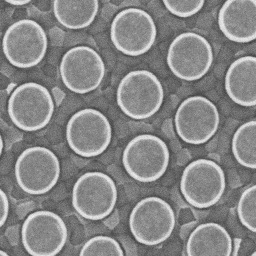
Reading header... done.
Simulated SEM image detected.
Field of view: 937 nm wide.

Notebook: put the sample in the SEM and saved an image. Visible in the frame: a regular array of raised bodies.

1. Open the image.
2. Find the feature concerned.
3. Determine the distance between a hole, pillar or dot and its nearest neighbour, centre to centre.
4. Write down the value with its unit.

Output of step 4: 228 nanometres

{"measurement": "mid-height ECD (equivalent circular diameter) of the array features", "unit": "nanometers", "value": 158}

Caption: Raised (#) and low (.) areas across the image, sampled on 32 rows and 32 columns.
.......#####.........####...####
.......#####...###....##....####
.......####...#####.........####
.####.........#####.........####
.#####........#####....##....###
.#####........#####...####......
.####....###....##...#####......
.####...#####........#####....##
........#####........#####...###
........#####...###...###...####
........####...#####........####
..####.........#####.........###
.#####.........#####....##...###
.#####.........#####...####.....
.#####...####...##....#####.....
..###....####.........#####....#
.........#####........#####...##
.........#####...###...###...###
.........####...#####........###
...####.........#####.........##
..#####.........#####...###...##
..#####.........####...#####....
..#####...####.........#####....
...###...#####.........#####....
.........#####.........####...##
#........#####...####...##....##
#.........####...####.........##
...####.........######........##
...#####........######...###...#
...#####.........####...#####...
...#####...####.........#####...
....###...#####.........#####...